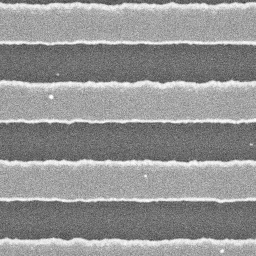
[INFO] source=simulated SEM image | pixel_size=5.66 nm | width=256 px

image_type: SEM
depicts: lines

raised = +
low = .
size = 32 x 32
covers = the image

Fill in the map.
+.....++++++...+++...++..+.+++++
++++++++++++++++++++++++++++++++
++++++++++++++++++++++++++++++++
++++++++++++++++++++++++++++++++
++++++++++++++++++++++++++++++++
......+.........................
................................
................................
................................
................................
++++++++++++++++++++++++++++++++
++++++++++++++++++++++++++++++++
++++++++++++++++++++++++++++++++
++++++++++++++++++++++++++++++++
++++++++++++++++++++++++++++++++
................................
................................
................................
................................
................................
++++++++++++++++++++++++++++++++
++++++++++++++++++++++++++++++++
++++++++++++++++++++++++++++++++
++++++++++++++++++++++++++++++++
++++++++++++++++++++++++++++++++
................................
................................
................................
................................
................................
++++++++++++++++++++++++++++++++
++++++++++++++++++++++++++++++++